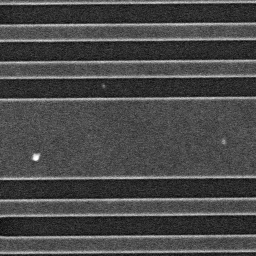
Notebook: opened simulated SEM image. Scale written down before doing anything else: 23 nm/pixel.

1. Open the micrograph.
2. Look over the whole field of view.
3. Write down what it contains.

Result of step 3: groups of lines, slits or small figures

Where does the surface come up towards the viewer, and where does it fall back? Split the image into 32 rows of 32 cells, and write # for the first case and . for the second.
##########......................
................................
................................
################################
################################
................................
................................
................................
################################
################################
................................
................................
################################
################################
################################
################################
################################
################################
################################
################################
################################
################################
................................
................................
................................
################################
################################
................................
................................
..................##############
################################
######################..........